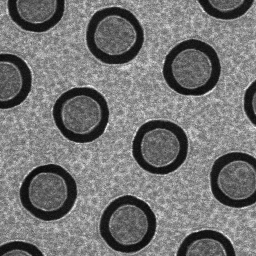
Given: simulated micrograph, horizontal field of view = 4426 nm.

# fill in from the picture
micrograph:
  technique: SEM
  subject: ring-shaped grooves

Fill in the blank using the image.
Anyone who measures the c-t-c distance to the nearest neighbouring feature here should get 1450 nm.